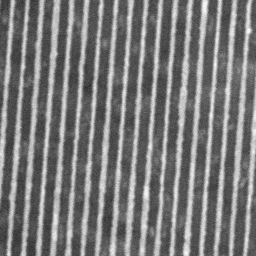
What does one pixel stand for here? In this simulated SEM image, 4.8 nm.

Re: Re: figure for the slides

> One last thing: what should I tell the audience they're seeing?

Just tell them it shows parallel lines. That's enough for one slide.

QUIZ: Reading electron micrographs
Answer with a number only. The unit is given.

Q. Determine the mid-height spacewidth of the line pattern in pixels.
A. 11.7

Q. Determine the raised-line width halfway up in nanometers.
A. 16.1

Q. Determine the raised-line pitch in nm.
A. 70.8